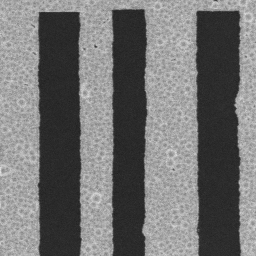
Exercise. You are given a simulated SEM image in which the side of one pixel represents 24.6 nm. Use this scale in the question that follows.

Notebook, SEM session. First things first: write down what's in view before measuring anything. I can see one or a few lines or trenches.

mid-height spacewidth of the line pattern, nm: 1020